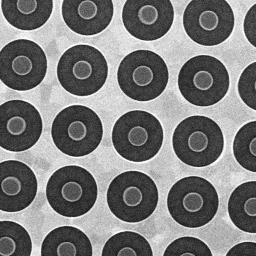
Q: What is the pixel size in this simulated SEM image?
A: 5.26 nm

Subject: an array of small figures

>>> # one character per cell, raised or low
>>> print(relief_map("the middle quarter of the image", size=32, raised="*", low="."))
...***.....***............****..
..*****....**.....****....***...
...****....**....*****....***...
....*......**....*****....**....
..........***.....***.....**....
..........****............***...
.........*****...........****...
**.....********.........*****...
****************.......*******..
*******************************.
*....***************************
.......**********..*************
........*******.......**********
.........*****.........********.
...*.....****...........*****...
.****.....**.............***....
.****.....**.....***.....**.....
.****.....**....*****....**.....
..**.....***....*****....**....*
.........***.....***.....**....*
.........***............***....*
........*****...........***.....
......********.........*****....
***************.......******....
*****************...**********..
....***************************.
......**************************
.......*******.......***********
........*****.........********..
........****...........*****....
****....***............****.....
****....***.....***.....**......